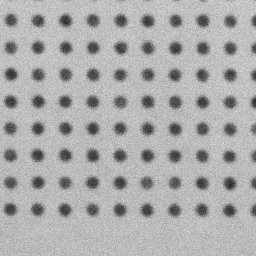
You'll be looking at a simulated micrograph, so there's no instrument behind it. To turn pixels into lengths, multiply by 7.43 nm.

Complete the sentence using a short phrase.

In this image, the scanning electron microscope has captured a regular array of holes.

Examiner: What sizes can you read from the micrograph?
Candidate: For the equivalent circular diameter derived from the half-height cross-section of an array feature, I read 12.6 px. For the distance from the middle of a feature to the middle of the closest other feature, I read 26.9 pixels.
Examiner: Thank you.